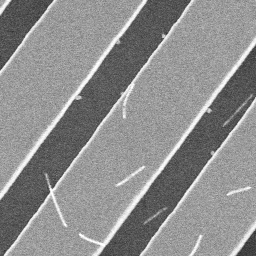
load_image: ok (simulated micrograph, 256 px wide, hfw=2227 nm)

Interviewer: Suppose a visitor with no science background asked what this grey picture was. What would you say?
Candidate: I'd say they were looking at lines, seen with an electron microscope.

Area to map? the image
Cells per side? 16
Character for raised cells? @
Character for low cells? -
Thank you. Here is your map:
---@@@@@@---@@@@
--@@@@@@---@@@@@
-@@@@@@---@@@@@@
-@@@@@@--@@@@@@-
@@@@@@---@@@@@@-
@@@@@---@@@@@@--
@@@@---@@@@@@---
@@@@--@@@@@@---@
@@@---@@@@@@--@@
@@---@@@@@@--@@@
@---@@@@@@---@@@
@--@@@@@@---@@@@
---@@@@@@--@@@@@
--@@@@@@---@@@@@
-@@@@@@---@@@@@@
-@@@@@@--@@@@@@-